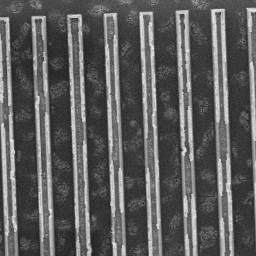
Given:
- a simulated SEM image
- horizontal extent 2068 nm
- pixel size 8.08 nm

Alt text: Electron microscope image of parallel lines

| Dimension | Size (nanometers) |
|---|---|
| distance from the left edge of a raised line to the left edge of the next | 290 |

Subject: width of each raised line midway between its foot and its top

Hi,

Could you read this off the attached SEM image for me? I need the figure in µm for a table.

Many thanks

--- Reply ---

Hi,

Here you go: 0.0959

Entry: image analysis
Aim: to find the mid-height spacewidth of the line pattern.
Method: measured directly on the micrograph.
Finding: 193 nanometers